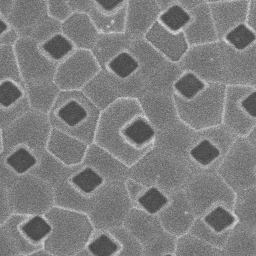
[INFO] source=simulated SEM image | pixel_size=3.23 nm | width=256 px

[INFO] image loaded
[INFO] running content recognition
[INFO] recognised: a regular array of holes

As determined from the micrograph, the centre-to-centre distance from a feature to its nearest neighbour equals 220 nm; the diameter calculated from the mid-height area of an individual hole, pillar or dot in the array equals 79.5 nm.